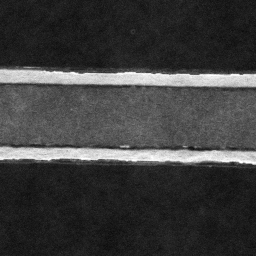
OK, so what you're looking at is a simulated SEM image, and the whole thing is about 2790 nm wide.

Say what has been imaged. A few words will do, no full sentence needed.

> one or a few lines or trenches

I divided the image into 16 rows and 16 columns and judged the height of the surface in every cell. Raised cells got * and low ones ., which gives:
****************
****************
****************
****************
****************
................
................
................
................
................
****************
****************
****************
****************
****************
****************